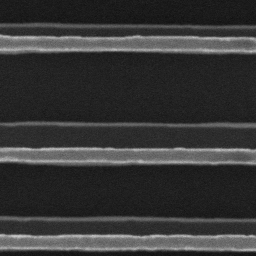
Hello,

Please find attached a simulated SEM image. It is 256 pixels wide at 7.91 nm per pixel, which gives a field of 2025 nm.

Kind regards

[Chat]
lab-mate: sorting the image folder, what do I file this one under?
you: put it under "lines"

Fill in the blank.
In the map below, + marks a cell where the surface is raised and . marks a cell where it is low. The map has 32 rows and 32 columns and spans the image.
................................
................................
................................
++++++++++++++++++++++++++++++++
++++++++++++++++++++++++++++++++
++++++++++++++++++++++++++++++++
................................
................................
................................
................................
................................
................................
................................
................................
................................
................................
++++++++++++++++++++++++++++++++
++++++++++++++++++++++++++++++++
++++++++++++++++++++++++++++++++
++++++++++++++++++++++++++++++++
................................
................................
................................
................................
................................
................................
................................
++++++++....+++++++.............
++++++++++++++++++++++++++++++++
++++++++++++++++++++++++++++++++
++++++++++++++++++++++++++++++++
................................